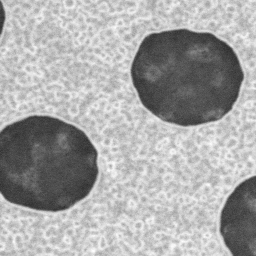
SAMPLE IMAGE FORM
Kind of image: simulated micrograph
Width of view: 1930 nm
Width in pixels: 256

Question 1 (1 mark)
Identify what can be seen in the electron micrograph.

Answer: holes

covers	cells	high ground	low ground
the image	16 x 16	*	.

****************
****************
*********.....**
********.......*
********.......*
********.......*
*********......*
*...******....**
.....***********
......**********
......**********
......*********.
.....*********..
**************..
**************..
**************..